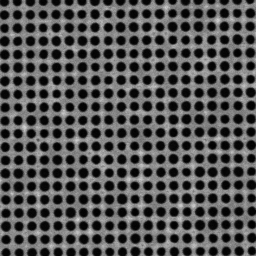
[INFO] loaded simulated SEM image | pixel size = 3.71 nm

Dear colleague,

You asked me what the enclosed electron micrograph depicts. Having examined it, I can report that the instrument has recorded a regular array of holes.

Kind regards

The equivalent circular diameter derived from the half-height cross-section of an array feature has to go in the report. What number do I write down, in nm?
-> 34.5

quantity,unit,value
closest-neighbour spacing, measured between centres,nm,47.4